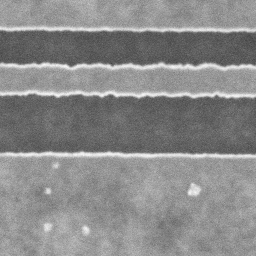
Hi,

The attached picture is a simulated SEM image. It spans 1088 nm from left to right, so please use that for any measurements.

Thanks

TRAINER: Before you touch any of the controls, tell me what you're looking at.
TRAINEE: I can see lines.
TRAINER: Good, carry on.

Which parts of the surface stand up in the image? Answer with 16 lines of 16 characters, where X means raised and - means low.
XXXXXXXXXXXXXXXX
XXXXXXXXXXXXXXXX
----------------
----------------
XXXXXXXXXXXXXXXX
XXXXXXXXXXXXXXXX
----------------
----------------
----------------
----------------
XXXXXXXXXXXXXXXX
XXXXXXXXXXXXXXXX
XXXXXXXXXXXXXXXX
XXXXXXXXXXXXXXXX
XXXXXXXXXXXXXXXX
XXXXXXXXXXXXXXXX